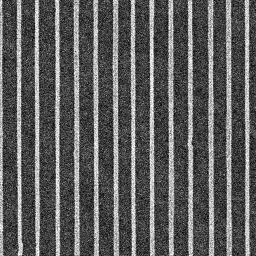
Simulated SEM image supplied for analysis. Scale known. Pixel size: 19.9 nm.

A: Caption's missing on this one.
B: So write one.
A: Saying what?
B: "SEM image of parallel lines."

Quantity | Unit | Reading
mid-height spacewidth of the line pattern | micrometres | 0.304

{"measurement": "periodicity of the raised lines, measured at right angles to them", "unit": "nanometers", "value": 378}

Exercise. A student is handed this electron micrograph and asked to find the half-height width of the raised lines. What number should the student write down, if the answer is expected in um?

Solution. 0.0697